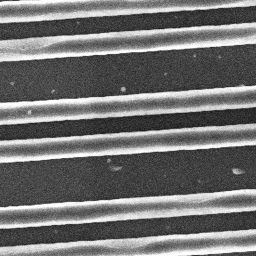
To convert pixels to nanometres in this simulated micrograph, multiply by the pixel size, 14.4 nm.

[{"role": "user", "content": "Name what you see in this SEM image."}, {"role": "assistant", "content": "lines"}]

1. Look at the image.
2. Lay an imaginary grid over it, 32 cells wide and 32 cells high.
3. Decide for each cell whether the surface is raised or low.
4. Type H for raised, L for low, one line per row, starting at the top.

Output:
HHHHHHHHHHHHHHHHHHHHHHHHHHHHHHHL
HHHHHHHHHHHHHHHHHLLLLLLLLLLLLLLL
HHLLLLLLLLLLLLLLLLLLLLLLLLLLLLLL
LLLLLLLLLLLLLLLLLLLLLLLLLHHHHHHH
LLLLLLLLLLLLHHHHHHHHHHHHHHHHHHHH
HHHHHHHHHHHHHHHHHHHHHHHHHHHHLLLL
HHHHHHHHHHHHHHHLLLLLLLLLLLLLLLLL
LLLLLLLLLLLLLLLLLLLLLLLLLLLLLLLL
LLLLLLLLLLLLLLLLLLLLLLLLLLLLLLLL
LLLLLLLLLLLLLLLLLLLLLLLLLLLLLLLL
LLLLLLLLLLLLLLLLLLLLLLLLLLLLLLLL
LLLLLLLLLLLLLLLLLLLLLLLLLHHHHHHH
LLLLLLLLLLLHHHHHHHHHHHHHHHHHHHHH
HHHHHHHHHHHHHHHHHHHHHHHHHHHLLLLL
HHHHHHHHHHHHHLLLLLLLLLLLLLLLLLLL
LLLLLLLLLLLLLLLLLLLLLLLLLLLLLLLL
LLLLLLLLLLLLLLLLLLLLHHHHHHHHHHHH
LLLLLLHHHHHHHHHHHHHHHHHHHHHHHHHH
HHHHHHHHHHHHHHHHHHHHHHHHHLLLLLLL
HHHHHHHHHLLLLLLLLLLLLLLLLLLLLLLL
LLLLLLLLLLLLLLLLLLLLLLLLLLLLLLLL
LLLLLLLLLLLLLLLLLLLLLLLLLLLLLLLL
LLLLLLLLLLLLLLLLLLLLLLLLLLLLLLLL
LLLLLLLLLLLLLLLLLLLLLLLLLLLLLLLL
LLLLLLLLLLLLLLLLLLLLLLLLLHHHHHHH
LLLLLLLLHHHHHHHHHHHHHHHHHHHHHHHH
HHHHHHHHHHHHHHHHHHHHHHHHHLLLLLLL
HHHHHHHHHHHHHLLLLLLLLLLLLLLLLLLL
LLLLLLLLLLLLLLLLLLLLLLLLLLLLLLLL
LLLLLLLLLLLLLLLLLLLLLLLLHHHHHHHH
LLLLLLLLLHHHHHHHHHHHHHHHHHHHHHHH
HHHHHHHHHHHHHHHHHHHHHHHHHHLLLLLL